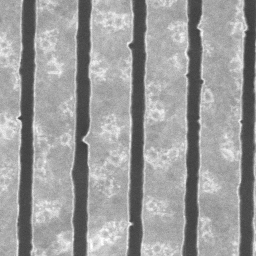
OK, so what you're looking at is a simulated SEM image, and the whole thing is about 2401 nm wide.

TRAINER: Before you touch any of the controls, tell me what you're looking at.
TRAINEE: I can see parallel lines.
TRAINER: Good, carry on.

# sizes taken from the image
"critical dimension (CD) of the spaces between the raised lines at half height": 0.117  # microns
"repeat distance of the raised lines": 55.4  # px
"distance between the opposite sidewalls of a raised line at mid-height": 394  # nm